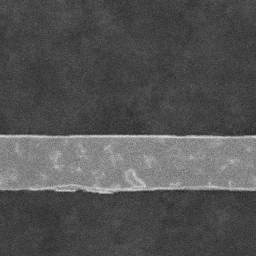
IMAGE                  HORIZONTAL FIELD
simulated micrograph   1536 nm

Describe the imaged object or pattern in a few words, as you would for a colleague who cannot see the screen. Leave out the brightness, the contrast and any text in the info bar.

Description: one or a few lines or trenches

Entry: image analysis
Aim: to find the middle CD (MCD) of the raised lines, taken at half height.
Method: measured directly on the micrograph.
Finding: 311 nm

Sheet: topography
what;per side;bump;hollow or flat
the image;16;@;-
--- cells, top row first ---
----------------
----------------
----------------
----------------
----------------
----------------
----------------
----------------
----------------
@@@@@@@@@@@@@@@@
@@@@@@@@@@@@@@@@
@@@@@@@@@@@@@@@@
----------------
----------------
----------------
----------------